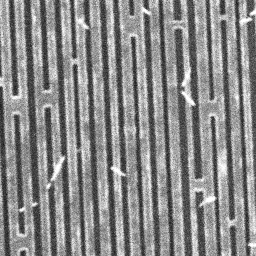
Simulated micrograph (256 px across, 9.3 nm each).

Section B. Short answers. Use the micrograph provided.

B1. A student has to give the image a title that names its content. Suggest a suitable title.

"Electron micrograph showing parallel lines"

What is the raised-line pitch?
139 nanometers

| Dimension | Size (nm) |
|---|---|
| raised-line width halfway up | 77.8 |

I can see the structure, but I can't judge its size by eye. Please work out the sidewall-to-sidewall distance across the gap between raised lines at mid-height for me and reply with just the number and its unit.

69.7 nm